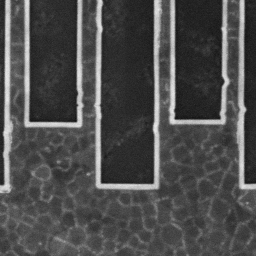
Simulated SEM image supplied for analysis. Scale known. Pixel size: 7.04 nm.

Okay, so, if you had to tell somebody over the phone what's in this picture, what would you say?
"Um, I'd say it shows one or a few lines or trenches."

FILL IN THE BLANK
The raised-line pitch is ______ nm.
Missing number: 507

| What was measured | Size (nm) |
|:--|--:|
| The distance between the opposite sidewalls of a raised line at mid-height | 142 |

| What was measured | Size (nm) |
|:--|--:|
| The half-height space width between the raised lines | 364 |